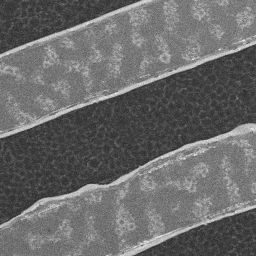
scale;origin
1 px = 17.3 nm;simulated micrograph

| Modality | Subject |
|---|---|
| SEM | one or a few lines or trenches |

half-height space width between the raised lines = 77.7 pixels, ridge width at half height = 1310 nm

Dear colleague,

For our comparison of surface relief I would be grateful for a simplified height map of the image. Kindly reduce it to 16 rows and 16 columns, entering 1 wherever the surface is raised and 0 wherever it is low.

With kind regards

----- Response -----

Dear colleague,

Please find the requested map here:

0000000011111111
0000011111111111
0001111111111111
1111111111111100
1111111111100000
1111111100000000
1111100000000000
1110000000000000
0000000000000011
0000000000011111
0000000001111111
0000000111111111
0001111111111111
0111111111111100
1111111111100000
1111111110000000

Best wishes